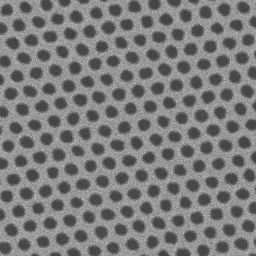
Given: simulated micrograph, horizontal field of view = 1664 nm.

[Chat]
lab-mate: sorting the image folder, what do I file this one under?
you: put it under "a regular array of holes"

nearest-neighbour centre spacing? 122 nm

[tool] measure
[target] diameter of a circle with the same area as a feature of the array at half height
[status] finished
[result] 86.2 nm